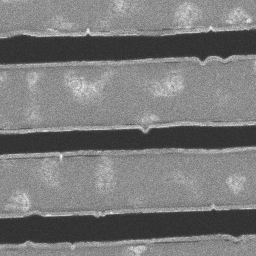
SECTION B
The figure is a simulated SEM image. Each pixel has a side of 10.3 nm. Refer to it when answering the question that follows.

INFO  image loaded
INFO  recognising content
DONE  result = one or a few lines or trenches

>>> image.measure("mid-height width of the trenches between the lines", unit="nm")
611